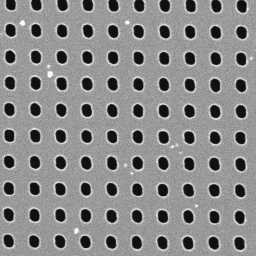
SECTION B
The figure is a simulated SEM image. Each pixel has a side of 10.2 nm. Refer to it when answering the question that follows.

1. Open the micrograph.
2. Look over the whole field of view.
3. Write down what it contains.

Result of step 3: a regular array of holes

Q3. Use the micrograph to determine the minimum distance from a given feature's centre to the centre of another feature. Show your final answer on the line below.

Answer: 0.262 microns